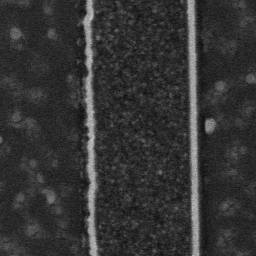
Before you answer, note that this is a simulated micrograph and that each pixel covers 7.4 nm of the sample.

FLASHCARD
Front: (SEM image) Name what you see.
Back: one or a few lines or trenches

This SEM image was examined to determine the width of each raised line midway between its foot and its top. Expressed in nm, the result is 766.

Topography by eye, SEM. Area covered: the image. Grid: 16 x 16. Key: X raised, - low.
------XXXXXX----
-----XXXXXXX----
------XXXXXX----
------XXXXXX----
------XXXXXX----
------XXXXXX----
------XXXXXX----
------XXXXXX----
------XXXXXX----
------XXXXXX----
------XXXXXX----
------XXXXXX----
------XXXXXX----
------XXXXXX----
------XXXXXX----
------XXXXXX----